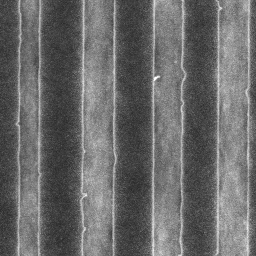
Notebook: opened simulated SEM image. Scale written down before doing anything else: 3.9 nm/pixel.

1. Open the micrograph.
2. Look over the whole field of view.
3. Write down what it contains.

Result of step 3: one or a few lines or trenches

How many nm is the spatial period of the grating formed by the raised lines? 271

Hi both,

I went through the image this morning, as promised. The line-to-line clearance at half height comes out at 111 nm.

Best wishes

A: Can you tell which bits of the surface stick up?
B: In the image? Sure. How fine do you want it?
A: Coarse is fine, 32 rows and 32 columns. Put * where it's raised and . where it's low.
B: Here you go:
**...*****....*****....****....*
***..*****....*****....****....*
***..*****....*****....****....*
***..*****....*****....****....*
***..*****....*****....****....*
***..*****....*****....****....*
**...*****....*****....****....*
**...*****....*****....****....*
**...*****....*****....****....*
**...*****....*****....****....*
**...*****....*****....****....*
**...*****....*****....****....*
**...*****....*****....****....*
**...*****....*****....****....*
**...*****....*****....****....*
**...*****....*****....****....*
**...*****....*****....*.**....*
**...*****....*****....****....*
**...*****....*****....****....*
**...*****....*****....****....*
**...*****....*****....****....*
**...*****....*****....****....*
**...*****....*****....****....*
**...*****....*****....****....*
**...******...*****....****....*
**...*****....*****....****....*
**...*****....*****....****....*
**...*****....*****....****....*
**...******...*****....****....*
**...*****....*****....****....*
**...*****....*****....****....*
**...*****....*****....****....*